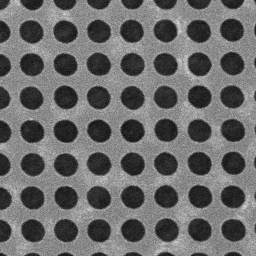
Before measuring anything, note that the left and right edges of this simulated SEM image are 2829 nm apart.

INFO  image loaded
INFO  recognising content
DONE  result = a regular array of holes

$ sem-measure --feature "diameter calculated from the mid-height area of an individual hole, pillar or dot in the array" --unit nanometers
267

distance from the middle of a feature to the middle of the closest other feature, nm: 364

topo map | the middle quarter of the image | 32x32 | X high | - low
---XX-------XX------XX-------XX-
---XXX------XX------XXX-----XXX-
---XXXX----XXXX----XXXXX----XXXX
XXXXXXXXXXXXXXXXXXXXXXXXXXXXXXXX
XXXXXXXXXXXXXXXXXXXXXXXXXXXXXXXX
-XXXXXXX-XXXXXXX--XXXXXXX-XXXXXX
---XXX-----XXXX----XXXX-----XXX-
---XXX-----XXX------XXX-----XXX-
----XX------XX------XX-------XX-
---XXX------XX------XXX-----XXX-
---XXX-----XXXX----XXXX-----XXXX
XXXXXXXXXXXXXXXXX-XXXXXXXXXXXXXX
XXXXXXXXXXXXXXXXXXXXXXXXXXXXXXXX
XXXXXXXXXXXXXXXXXXXXXXXXXXXXXXXX
--XXXXX----XXXX----XXXX----XXXXX
---XXX------XX------XXX-----XXX-
----XX------XX------XX-------XX-
----XX------XX------XXX------XX-
---XXXX-----XXX-----XXX-----XXX-
--XXXXXX--XXXXXX---XXXXXX--XXXXX
XXXXXXXXXXXXXXXXXXXXXXXXXXXXXXXX
XXXXXXXXXXXXXXXXXXXXXXXXXXXXXXXX
--XXXXX---XXXXXX---XXXXX---XXXXX
---XXX-----XXX------XXX-----XXX-
---XXX------XX------XX------XXX-
----XX------XX------XXX------XX-
---XXX------XXX-----XXX-----XXX-
---XXXX----XXXXX---XXXXX---XXXXX
XXXXXXXXXXXXXXXXXXXXXXXXXXXXXXXX
XXXXXXXXXXXXXXXXXXXXXXXXXXXXXXXX
-XXXXXXX-XXXXXXX--XXXXXX---XXXXX
---XXX-----XXXX-----XXX-----XXX-